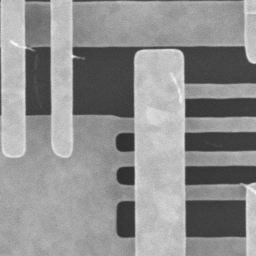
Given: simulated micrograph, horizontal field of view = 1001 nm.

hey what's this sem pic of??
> wiring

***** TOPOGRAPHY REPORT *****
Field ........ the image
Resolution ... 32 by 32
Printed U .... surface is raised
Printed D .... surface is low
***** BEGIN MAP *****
UUUDDDUUUDDDDDDDDDDDDDDDDDDDDDDU
UUUDDDUUUDDDDDDDDDDDDDDDDDDDDDDU
UUUDDDUUUDDDDDDDDDDDDDDDDDDDDDDU
UUUDDDUUUDDDDDDDDDDDDDDDDDDDDDDU
UUUDDDUUUDDDDDDDDDDDDDDDDDDDDDDU
UUUDDDUUUDDDDDDDDDDDDDDDDDDDDDDU
UUUDDDUUUDDDDDDDDUUUUUUDDDDDDDDU
UUUDDDUUUDDDDDDDDUUUUUUDDDDDDDDU
UUUDDDUUUDDDDDDDDUUUUUUDDDDDDDDD
UUUDDDUUUDDDDDDDDUUUUUUDDDDDDDDD
UUUDDDUUUDDDDDDDDUUUUUUDDDDDDDDD
UUUDDDUUUDDDDDDDDUUUUUUDDDDDDDDD
UUUDDDUUUDDDDDDDDUUUUUUDDDDDDDDD
UUUDDDUUUDDDDDDDDUUUUUUDDDDDDDDD
UUUDDDUUUDDDDDDDDUUUUUUDDDDDDDDD
UUUDDDUUUDDDDDDDDUUUUUUDDDDDDDDD
UUUDDDUUUDDDDDDDDUUUUUUDDDDDDDDD
UUUDDDUUUDDDDDDDDUUUUUUDDDDDDDDD
UUUDDDDUUDDDDDDDDUUUUUUDDDDDDDDD
DUUDDDDUUDDDDDDDDUUUUUUDDDDDDDDD
DDDDDDDDDDDDDDDDDUUUUUUDDDDDDDDD
DDDDDDDDDDDDDDDDDUUUUUUDDDDDDDDD
DDDDDDDDDDDDDDDDDUUUUUUDDDDDDDDD
DDDDDDDDDDDDDDDDDUUUUUUDDDDDDDDU
DDDDDDDDDDDDDDDDDUUUUUUDDDDDDDDU
DDDDDDDDDDDDDDDDDUUUUUUDDDDDDDDU
DDDDDDDDDDDDDDDDDUUUUUUDDDDDDDDU
DDDDDDDDDDDDDDDDDUUUUUUDDDDDDDDU
DDDDDDDDDDDDDDDDDUUUUUUDDDDDDDDU
DDDDDDDDDDDDDDDDDUUUUUUDDDDDDDDU
DDDDDDDDDDDDDDDDDUUUUUUDDDDDDDDU
DDDDDDDDDDDDDDDDDUUUUUUDDDDDDDDU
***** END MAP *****